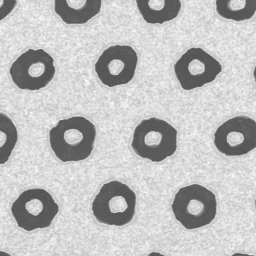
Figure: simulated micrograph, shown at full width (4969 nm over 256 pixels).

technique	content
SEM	a regular array of ring-shaped grooves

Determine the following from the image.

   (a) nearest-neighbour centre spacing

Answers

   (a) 1.52 µm